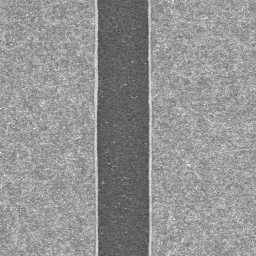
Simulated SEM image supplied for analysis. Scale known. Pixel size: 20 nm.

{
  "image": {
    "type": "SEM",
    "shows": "one or a few lines or trenches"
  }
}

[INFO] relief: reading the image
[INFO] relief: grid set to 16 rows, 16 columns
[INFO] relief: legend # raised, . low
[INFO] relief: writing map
######...#######
######...#######
######...#######
######...#######
######...#######
######...#######
######...#######
######...#######
######...#######
######...#######
######...#######
######...#######
######...#######
######...#######
######...#######
######...#######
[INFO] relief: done